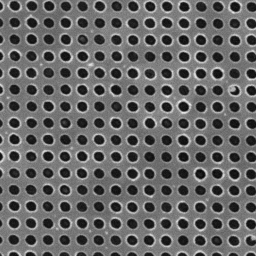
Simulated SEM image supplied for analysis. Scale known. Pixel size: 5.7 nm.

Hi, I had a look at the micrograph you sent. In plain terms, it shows a regular array of holes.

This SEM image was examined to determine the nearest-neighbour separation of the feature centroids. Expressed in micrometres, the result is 0.0938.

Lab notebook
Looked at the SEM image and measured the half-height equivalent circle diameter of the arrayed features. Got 60.3 nm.